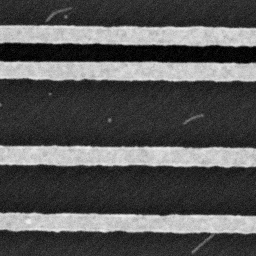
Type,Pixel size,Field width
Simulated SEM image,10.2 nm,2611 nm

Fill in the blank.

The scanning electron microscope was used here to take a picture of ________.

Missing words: lines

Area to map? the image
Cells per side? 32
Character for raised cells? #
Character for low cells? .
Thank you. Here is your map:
................................
................................
................................
#############.####...#..##......
################################
...............#################
................................
................................
################################
################################
................................
................................
................................
................................
................................
................................
................................
................................
#######################...##....
################################
#####.##########################
................................
................................
................................
................................
................................
................................
################################
################################
................................
................................
................................